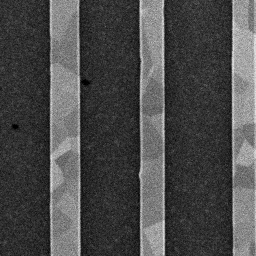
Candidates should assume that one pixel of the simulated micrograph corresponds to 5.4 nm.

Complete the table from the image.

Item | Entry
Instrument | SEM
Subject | one or a few lines or trenches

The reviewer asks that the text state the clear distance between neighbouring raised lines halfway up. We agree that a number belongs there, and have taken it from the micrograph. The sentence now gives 0.357 um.